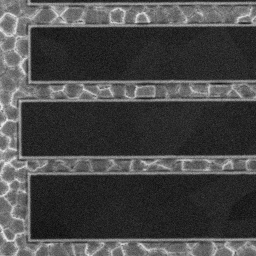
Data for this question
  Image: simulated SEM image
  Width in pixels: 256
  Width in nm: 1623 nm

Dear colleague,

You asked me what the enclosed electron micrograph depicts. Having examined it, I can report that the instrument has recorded one or a few lines or trenches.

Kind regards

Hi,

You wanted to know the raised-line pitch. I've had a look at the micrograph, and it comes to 485 nanometres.